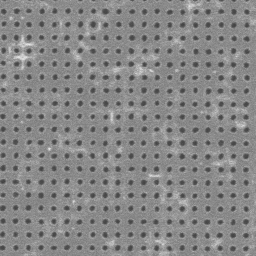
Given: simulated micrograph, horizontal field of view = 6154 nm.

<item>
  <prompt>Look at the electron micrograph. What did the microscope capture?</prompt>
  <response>a regular array of raised bodies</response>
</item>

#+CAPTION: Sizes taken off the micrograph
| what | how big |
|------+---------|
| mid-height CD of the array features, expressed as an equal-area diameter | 178 nanometres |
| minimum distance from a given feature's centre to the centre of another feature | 299 nanometers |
